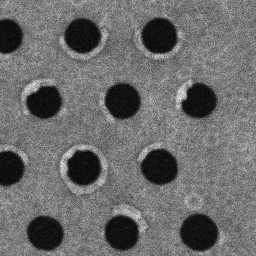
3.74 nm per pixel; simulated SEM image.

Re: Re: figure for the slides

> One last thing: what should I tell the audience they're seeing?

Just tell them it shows a regular array of holes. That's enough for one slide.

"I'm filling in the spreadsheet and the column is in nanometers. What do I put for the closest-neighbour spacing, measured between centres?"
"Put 284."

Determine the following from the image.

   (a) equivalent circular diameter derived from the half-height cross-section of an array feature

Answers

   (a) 130 nanometers